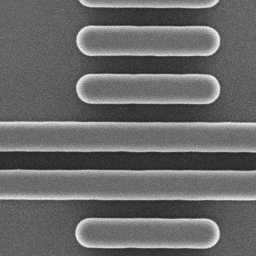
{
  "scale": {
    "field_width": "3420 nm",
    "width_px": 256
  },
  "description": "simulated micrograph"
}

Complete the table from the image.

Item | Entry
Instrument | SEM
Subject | groups of lines, slits or small figures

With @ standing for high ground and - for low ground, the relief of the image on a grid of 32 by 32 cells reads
----------@@@@@@@@@@@@@@@@@-----
--------------------------------
--------------------------------
-----------@@@@@@@@@@@@@@@------
----------@@@@@@@@@@@@@@@@@-----
----------@@@@@@@@@@@@@@@@@-----
----------@@@@@@@@@@@@@@@@@-----
--------------------------------
--------------------------------
-----------@@@@@@@@@@@@@@@------
----------@@@@@@@@@@@@@@@@@-----
----------@@@@@@@@@@@@@@@@@-----
----------@@@@@@@@@@@@@@@@@-----
--------------------------------
--------------------------------
@@@@@@@@@@@@@@@@@@@@@@@@@@@@@@@@
@@@@@@@@@@@@@@@@@@@@@@@@@@@@@@@@
@@@@@@@@@@@@@@@@@@@@@@@@@@@@@@@@
@@@@@@@@@@@@@@@@@@@@@@@@@@@@@@@@
--------------------------------
--------------------------------
@@@@@@@@@@@@@@@@@@@@@@@@@@@@@@@@
@@@@@@@@@@@@@@@@@@@@@@@@@@@@@@@@
@@@@@@@@@@@@@@@@@@@@@@@@@@@@@@@@
@@@@@@@@@@@@@@@@@@@@@@@@@@@@@@@@
--------------------------------
--------------------------------
----------@@@@@@@@@@@@@@@@------
----------@@@@@@@@@@@@@@@@@-----
----------@@@@@@@@@@@@@@@@@-----
----------@@@@@@@@@@@@@@@@@-----
--------------------------------